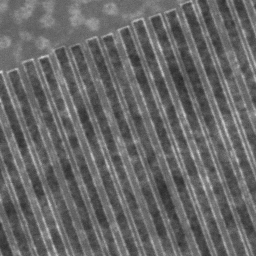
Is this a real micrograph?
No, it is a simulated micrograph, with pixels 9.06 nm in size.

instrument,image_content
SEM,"parallel lines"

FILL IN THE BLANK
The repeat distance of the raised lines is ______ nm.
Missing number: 152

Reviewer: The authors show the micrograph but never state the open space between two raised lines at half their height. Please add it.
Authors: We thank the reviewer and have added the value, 4.93 px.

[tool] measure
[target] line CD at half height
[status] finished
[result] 104 nanometres